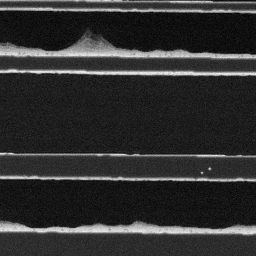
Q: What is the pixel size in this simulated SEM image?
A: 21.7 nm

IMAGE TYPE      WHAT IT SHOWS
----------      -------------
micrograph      lines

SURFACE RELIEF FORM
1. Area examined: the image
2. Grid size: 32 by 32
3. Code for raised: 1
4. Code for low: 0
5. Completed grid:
11111111111111111111111111111111
00000000000000000000000000000000
00000000000000000000000000000000
00000000000000000000000000000000
00000000000000000000000000000000
00000000000000000000000000000000
00000000001110000000000000000000
11111111111111111111111111111111
11111111111111111111111111111111
00000000000000000000000000000000
00000000000000000000000000000000
00000000000000000000000000000000
00000000000000000000000000000000
00000000000000000000000000000000
00000000000000000000000000000000
00000000000000000000000000000000
00000000000000000000000000000000
00000000000000000000000000000000
00000000000000000000000000000000
11111111111111111111111111100000
11111111111111111111111111111111
11111111111111111111111111111111
00000000000000000000000000000000
00000000000000000000000000000000
00000000000000000000000000000000
00000000000000000000000000000000
00000000000000000000000000000000
00000000000000000000000000000000
00000000000000000000000000000000
11111111111111111111111111111111
11111111111111111111111111111111
11111111111111111111111111111111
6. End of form